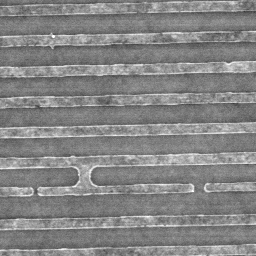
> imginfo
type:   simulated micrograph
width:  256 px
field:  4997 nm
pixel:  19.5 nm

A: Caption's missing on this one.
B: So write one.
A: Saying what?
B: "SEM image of parallel lines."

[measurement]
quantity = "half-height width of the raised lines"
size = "0.193 microns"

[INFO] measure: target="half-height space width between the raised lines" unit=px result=20.7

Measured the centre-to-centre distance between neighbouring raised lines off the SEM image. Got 595 nm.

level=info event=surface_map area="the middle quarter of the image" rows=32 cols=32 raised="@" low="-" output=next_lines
-@-@@@@@@@@@@@@@@@@@@@@@@@@@@@@@
@@@@@@@@@@@@@@@@@@@@@@@@@@@@@@@@
@@@@@@@@@@@@@@@@---------@------
--------------------------------
--------------------------------
--------------------------------
--------------------------------
------------------------------@@
@@@@@@@@@@@@@@@@@@@@@@@@@@@@@@@@
@@@@@@@@@@@@@@@@@@@@@@@@@@@@@@@@
@-------------------------------
--------------------------------
--------------------------------
--------------------------------
--------------------------------
---------@@@@@@@@@@@@@@@@@@@@@@@
@@@@@@@@@@@@@@@@@@@@@@@@@@@@@@@@
@@@@@@@@@@@@@@@@@@@@@@@@@@@@@@@-
--------------------------------
--------------------------------
--------------------------------
--------------------------------
--------------------------------
@@@@@@@@@@@@@@@@@@@@@@@@@@@@@@@@
@@@@@@@@@@@@@@@@@@@@@@@@@@@@@@@@
@@@@@@@@------------------------
---@@@@-------------------------
----@@--------------------------
----@@--------------------------
----@@@-------------------------
---@@@@@------@@@@@@@@@@@@@@@@@@
@@@@@@@@@@@@@@@@@@@@@@@@@@@@@@@@